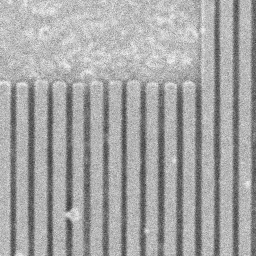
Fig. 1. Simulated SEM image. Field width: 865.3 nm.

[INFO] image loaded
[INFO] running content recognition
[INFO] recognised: parallel lines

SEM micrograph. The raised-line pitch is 0.063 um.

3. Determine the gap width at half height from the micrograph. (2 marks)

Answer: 6.89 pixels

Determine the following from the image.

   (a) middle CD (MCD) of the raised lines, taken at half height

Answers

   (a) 39.7 nm